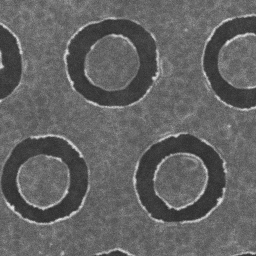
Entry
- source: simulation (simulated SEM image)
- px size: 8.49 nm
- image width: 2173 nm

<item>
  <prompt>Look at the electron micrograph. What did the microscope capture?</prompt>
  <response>ring-shaped grooves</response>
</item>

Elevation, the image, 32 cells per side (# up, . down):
################################
################################
#############...#############...
.#########........#########.....
..#######....##....########...##
..#######...#####..#######..####
..######...######...######.#####
...#####...######...#####..#####
...#####...######...#####..#####
...######..######..#######..####
..#######...####...#######...###
..########........#########.....
###########......###########....
##############################.#
################################
################################
################################
###.....############.....#######
##.......##########........#####
#...##....########...####..#####
#..#####...######...#####...####
..#######..######..#######..####
..#######..######..#######..####
..#######..######..#######..####
#..#####...######...#####...####
#...###...########...###...#####
##.......##########.......######
####...#############.....#######
################################
################################
################################
##############.#################